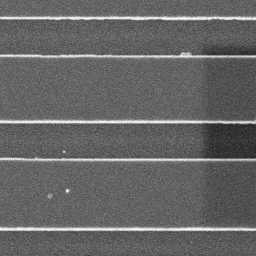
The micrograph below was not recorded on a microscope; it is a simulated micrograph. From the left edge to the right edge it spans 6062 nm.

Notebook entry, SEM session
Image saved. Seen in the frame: lines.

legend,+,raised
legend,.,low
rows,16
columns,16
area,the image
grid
++++++++++++++++
................
................
+++..+..........
++++++++++++++++
++++++++++++++++
++++++++++++++++
++++++++++++++++
................
................
++++++++++++++++
++++++++++++++++
++++++++++++++++
++++++++++++++++
................
................